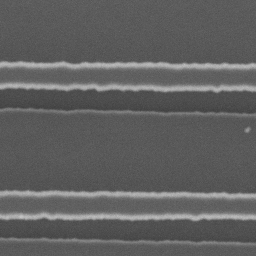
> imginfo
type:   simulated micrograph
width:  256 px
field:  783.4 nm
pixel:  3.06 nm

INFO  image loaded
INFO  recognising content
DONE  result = lines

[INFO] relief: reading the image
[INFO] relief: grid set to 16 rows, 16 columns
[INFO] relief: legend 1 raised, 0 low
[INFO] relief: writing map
0000000000000000
0000000000000000
0000000000000000
0000000000000000
1111111111111111
1111111111111111
0000000000000000
0000000000000000
0000000000000000
0000000000000000
0000000000000000
0000000000000000
1111111111111111
1111111111111111
0000000000000000
0000000000000000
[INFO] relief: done